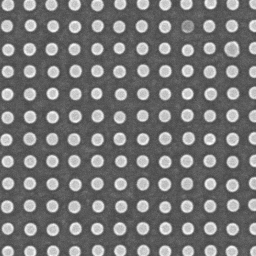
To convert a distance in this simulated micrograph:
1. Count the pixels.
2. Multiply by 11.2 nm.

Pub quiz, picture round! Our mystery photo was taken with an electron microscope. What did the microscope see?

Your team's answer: a regular array of raised bodies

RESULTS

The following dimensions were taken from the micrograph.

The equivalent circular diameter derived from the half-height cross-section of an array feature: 0.127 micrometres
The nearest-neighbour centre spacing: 244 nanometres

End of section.